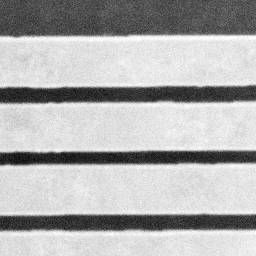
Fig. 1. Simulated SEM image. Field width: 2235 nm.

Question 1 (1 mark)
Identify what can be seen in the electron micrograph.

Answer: lines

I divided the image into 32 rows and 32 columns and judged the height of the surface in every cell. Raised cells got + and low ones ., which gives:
................................
................................
................................
................................
................................
++++++++++++++++++++++++++++++++
++++++++++++++++++++++++++++++++
++++++++++++++++++++++++++++++++
++++++++++++++++++++++++++++++++
++++++++++++++++++++++++++++++++
++++++++++++++++++++++++++++++++
................................
................................
++++++++++++++++++++++++++++++++
++++++++++++++++++++++++++++++++
++++++++++++++++++++++++++++++++
++++++++++++++++++++++++++++++++
++++++++++++++++++++++++++++++++
++++++++++++++++++++++++++++++++
................................
................................
++++++++++++++++++++++++++++++++
++++++++++++++++++++++++++++++++
++++++++++++++++++++++++++++++++
++++++++++++++++++++++++++++++++
++++++++++++++++++++++++++++++++
++++++++++++++++++++++++++++++++
................................
................................
++++++++++++++++++++++++++++++++
++++++++++++++++++++++++++++++++
++++++++++++++++++++++++++++++++